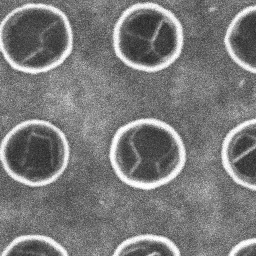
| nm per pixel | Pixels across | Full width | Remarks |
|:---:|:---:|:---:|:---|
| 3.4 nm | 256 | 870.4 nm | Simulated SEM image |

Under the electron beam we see raised bodies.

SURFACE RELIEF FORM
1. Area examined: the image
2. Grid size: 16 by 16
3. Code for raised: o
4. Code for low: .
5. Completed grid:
.oo.....oo......
oooo...oooo....o
oooo...oooo...oo
oooo....ooo....o
................
................
................
................
.ooo...oooo...oo
oooo...oooo...oo
oooo...oooo...oo
..o.....oo.....o
................
................
................
.ooo....ooo....o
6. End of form